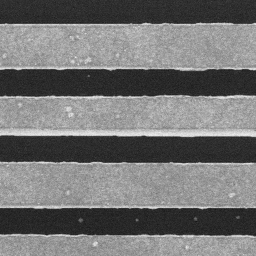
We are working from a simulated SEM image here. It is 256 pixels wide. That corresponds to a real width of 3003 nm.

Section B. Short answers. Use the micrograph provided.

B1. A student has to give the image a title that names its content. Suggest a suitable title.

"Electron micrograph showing lines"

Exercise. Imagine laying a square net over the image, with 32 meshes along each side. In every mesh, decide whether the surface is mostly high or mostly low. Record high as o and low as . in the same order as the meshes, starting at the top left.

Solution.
................................
................................
................................
oooooooooooooooooooooooooooooooo
oooooooooooooooooooooooooooooooo
oooooooooooooooooooooooooooooooo
oooooooooooooooooooooooooooooooo
oooooooooooooooooooooooooooooooo
oooooooooooooooooooooooooooooooo
................................
................................
................................
oooooooooooooooooooooooooooooooo
oooooooooooooooooooooooooooooooo
oooooooooooooooooooooooooooooooo
oooooooooooooooooooooooooooooooo
oooooooooooooooooooooooooooooooo
................................
................................
................................
oooooooooooooooooooooooooooooooo
oooooooooooooooooooooooooooooooo
oooooooooooooooooooooooooooooooo
oooooooooooooooooooooooooooooooo
oooooooooooooooooooooooooooooooo
oooooooooooooooooooooooooooooooo
................................
................................
................................
ooooo..o........................
oooooooooooooooooooooooooooooooo
oooooooooooooooooooooooooooooooo